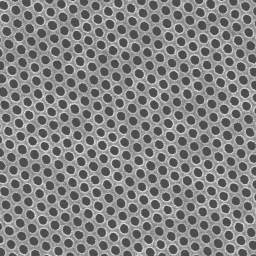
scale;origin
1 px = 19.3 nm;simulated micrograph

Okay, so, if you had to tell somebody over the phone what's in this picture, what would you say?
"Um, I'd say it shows a regular array of holes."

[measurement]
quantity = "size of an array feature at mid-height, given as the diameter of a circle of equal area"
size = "174 nm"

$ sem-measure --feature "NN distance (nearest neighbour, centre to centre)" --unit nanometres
249